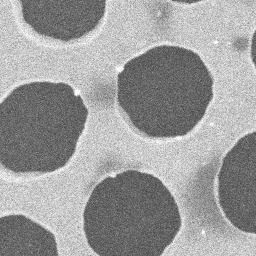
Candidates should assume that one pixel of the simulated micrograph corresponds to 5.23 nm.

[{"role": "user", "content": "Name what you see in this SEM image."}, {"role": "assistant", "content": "holes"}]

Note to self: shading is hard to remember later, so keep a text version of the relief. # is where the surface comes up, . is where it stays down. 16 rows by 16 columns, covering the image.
#......#########
##....##########
###..###########
#########...####
########.....###
#...###......###
.....##......###
.....###.....###
.....####..####.
.....#########..
....##########..
######....####..
#####......###..
..###......###..
...##......####.
....##....######